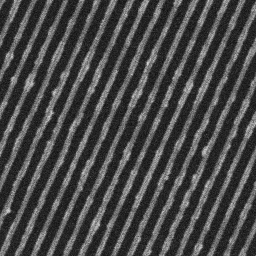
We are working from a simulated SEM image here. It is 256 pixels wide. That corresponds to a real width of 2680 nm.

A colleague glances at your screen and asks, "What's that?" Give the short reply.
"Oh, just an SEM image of parallel lines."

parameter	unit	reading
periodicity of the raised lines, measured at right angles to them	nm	154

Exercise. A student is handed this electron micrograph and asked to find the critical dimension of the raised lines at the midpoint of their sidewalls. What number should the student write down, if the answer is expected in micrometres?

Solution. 0.0491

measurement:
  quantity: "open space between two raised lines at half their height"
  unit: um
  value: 0.101